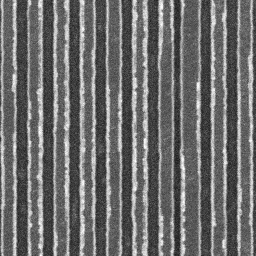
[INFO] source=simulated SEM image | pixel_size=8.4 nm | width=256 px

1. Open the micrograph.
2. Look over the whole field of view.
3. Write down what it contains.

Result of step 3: parallel lines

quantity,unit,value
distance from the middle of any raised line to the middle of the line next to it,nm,221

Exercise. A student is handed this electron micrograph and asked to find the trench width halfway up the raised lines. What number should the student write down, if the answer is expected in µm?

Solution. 0.104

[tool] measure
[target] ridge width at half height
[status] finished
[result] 112 nm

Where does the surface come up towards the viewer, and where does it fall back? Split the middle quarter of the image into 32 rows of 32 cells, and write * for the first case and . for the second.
*...****...***...****...***..***
*...****...***...****...***...**
*...****...***...****...***..***
*...****...***...****...***..***
*...***....***...****...***..***
*...****...***...****...***...**
*...****...***...****...***...**
*...****...***...****...***..***
*...****...***...****...***...**
*...****...***...****...***...**
*...****...***...****...***...**
*...****...***...****...***...**
*...****...***...****...***...**
*...****...***...****...***...**
*...****...***...****...***..***
*...****...***...****...***..***
*...****...***...****...***...**
*...****...***...****...***..***
*...****...***...****...***...**
*...****...***...****...***...**
*...****...***...****...***...**
*...****...***...****...***..***
*...****...***...****...***..***
*...****...***...***....***..***
*...****...***...****...***..***
*...****...***...****...***..***
*...****...***...****...***...**
*...****...***...****...***...**
*...****...***...****...***...**
*...****...***...****...***...**
*...****...***...****...***...**
*...****...***...****...***...**